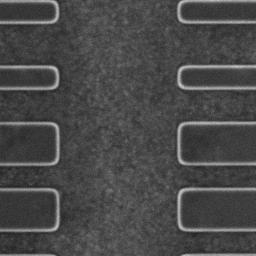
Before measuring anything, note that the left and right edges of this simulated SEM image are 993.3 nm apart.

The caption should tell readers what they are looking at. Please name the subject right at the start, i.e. groups of lines, slits or small figures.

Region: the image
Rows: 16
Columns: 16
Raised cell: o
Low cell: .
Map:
oooo.......ooooo
................
................
................
ooo........ooooo
ooo.........oooo
................
................
oooo.......ooooo
oooo.......ooooo
................
................
oooo.......ooooo
oooo.......ooooo
................
................